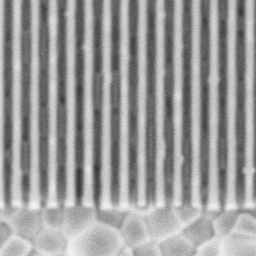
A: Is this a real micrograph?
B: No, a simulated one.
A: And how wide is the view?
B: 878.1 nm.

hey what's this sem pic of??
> parallel lines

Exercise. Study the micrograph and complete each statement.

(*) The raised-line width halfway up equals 25.8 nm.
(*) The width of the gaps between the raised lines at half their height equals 10.9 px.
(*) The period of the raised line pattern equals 61.5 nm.